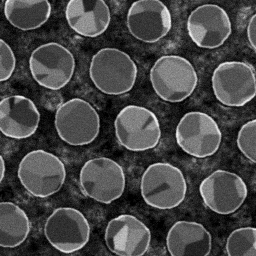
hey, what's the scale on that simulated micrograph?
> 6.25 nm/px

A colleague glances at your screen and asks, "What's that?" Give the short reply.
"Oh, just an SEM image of a regular array of raised bodies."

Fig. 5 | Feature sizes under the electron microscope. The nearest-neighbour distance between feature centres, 381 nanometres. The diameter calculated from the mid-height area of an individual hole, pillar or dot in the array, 0.276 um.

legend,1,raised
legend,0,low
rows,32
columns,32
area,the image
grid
01111100011110000111000000000000
01111100111111001111100011110000
01111100011111001111100011111001
00110000011110001111100011111001
00000000000000000111000011110001
10000010000000000000000001110000
10001111100011100000000000000000
11001111100011110000111000000000
11001111100111111001111100011110
10001111100111111001111110011111
00000111000011111001111100011111
00000000000001100000111100011111
01110000010000000000011000011110
11110001111100001100000000000000
11111001111100011110000111000000
11111001111100111111001111100001
11110001111100011111001111100011
00000000111100011111001111110011
00000000000000001110000111100011
00011110000000000000000001000001
00011111000111100000000000000000
00111111001111100011110000010000
00011111001111100011111000111100
00011110001111100011111001111110
00000100000111100011111001111110
11000000000000000001110000111100
11100001110000000000000000011000
11100011111000111000000000000000
11110011111001111100001110000000
11100011111001111110011111000111
11000001110001111110011111001111
00000000000000111100011111001111